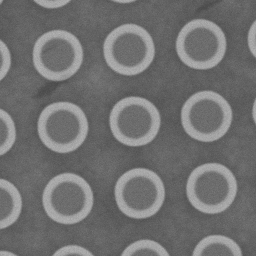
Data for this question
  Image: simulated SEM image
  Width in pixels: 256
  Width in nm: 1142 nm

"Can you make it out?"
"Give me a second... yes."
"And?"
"an array of small figures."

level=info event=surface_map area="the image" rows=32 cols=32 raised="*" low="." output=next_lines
.....***........................
................................
........................**......
...............***.....****....*
.....****.....*****...******...*
*...******...******...******...*
*...******...******...******...*
*...******...******....*****....
*...******....****......**......
*....****.......................
................................
.........................**.....
...............***.....*****....
......****....*****....******...
*....******...******...******...
**...******...******...******...
**...******...******...*****....
**...******....****......**.....
*.....****......................
................................
..........................*.....
................***.....*****...
*.....*****....*****....*****...
**....*****...******...*******..
***..*******..*******..******...
***..*******...*****....*****...
***...*****....*****.....***....
**.....***......................
................................
..........................**....
.................***.....*****..
*......****....******...******..